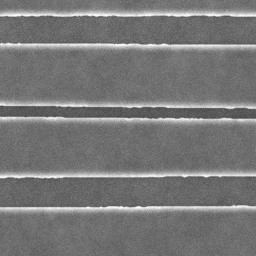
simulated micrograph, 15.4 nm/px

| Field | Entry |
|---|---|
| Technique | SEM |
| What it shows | lines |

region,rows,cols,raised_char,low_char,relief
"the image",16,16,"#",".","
################
................
................
################
################
################
################
################
################
################
################
................
................
################
################
################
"